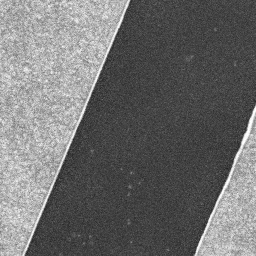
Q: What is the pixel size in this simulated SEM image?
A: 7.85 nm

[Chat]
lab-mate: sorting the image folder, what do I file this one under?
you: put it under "one or a few lines or trenches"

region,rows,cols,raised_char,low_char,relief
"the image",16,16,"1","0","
1111111100000000
1111111000000000
1111111000000000
1111111000000000
1111110000000000
1111110000000000
1111100000000000
1111100000000000
1111100000000001
1111000000000001
1111000000000001
1110000000000011
1110000000000011
1100000000000111
1100000000000111
1100000000001111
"